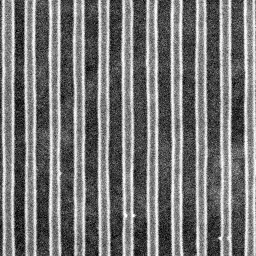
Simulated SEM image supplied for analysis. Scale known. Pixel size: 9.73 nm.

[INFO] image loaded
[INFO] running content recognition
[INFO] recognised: parallel lines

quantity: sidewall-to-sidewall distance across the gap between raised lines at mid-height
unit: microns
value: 0.145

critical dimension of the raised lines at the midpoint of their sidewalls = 96.1 nm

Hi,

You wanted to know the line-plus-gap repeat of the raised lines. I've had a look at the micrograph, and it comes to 235 nm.